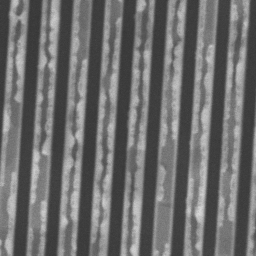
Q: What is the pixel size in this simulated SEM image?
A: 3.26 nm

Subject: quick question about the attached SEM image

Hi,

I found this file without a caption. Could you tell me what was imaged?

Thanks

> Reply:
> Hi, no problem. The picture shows parallel lines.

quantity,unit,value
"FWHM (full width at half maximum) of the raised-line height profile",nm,52.5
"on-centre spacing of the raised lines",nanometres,102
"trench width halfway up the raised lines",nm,49.2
